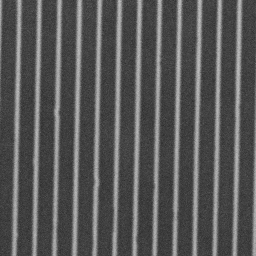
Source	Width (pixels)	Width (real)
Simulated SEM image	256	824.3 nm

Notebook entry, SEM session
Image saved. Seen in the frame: parallel lines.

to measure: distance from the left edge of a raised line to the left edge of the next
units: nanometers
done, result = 64.4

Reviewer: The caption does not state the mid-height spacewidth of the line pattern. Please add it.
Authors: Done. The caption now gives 51.9 nm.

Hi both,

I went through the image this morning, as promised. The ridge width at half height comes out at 0.0137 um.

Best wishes